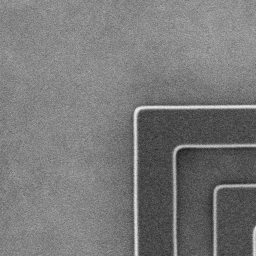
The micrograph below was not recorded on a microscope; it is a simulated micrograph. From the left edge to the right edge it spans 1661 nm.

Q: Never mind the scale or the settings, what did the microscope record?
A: groups of lines, slits or small figures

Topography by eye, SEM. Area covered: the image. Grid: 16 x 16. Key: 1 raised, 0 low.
0000000000000000
0000000000000000
0000000000000000
0000000000000000
0000000000000000
0000000000000000
0000000000000000
0000000011111111
0000000011111111
0000000011100000
0000000011100000
0000000011100000
0000000011100111
0000000011100111
0000000011100111
0000000011100111